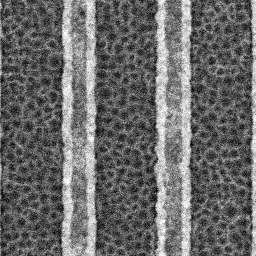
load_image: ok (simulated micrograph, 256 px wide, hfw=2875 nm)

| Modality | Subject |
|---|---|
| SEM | one or a few lines or trenches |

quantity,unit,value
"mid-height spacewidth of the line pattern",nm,777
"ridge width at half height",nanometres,276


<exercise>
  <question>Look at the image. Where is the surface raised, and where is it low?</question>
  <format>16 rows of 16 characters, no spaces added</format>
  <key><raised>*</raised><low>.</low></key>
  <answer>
....**....**....
....**....**....
....**....**....
....**....**....
....**....**....
....**....**....
....**....**....
....**....**....
....**....**....
....**....**....
....**....**....
....**....**....
....**....**....
....**....**....
....**....**....
....**....**....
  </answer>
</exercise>